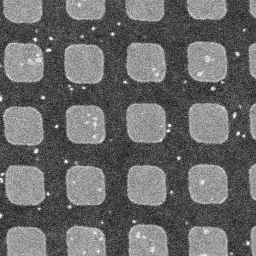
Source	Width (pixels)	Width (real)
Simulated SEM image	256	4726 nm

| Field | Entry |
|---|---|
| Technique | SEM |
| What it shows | a regular array of raised bodies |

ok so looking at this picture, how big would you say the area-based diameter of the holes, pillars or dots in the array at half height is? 756 nanometres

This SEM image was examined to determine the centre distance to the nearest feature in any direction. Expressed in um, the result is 1.12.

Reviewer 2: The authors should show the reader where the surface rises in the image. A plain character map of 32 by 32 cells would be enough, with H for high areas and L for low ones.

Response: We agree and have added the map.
LHHHHLLLHHHHHLLLHHHHLLLHHHHHLLLH
LHHHHLLLLHHHHLLLHHHHLLLLHHHHLLLH
LHHHHLLLLLLLLLLLLLHHLLLLLLLLLLLL
LLLLLLLLLLLLLLLLLLLLLLLLLLLLLLLL
LLLLLLLLLLLLLLLLLLLLLLLLLLLLLLLL
LHHLLLLLLLLLLLLLLHLLLLLLHHHLLLLL
LHHHHLLLHHHHHLLLHHHHLLLLHHHHLLLH
LHHHHLLLHHHHHLLLHHHHHLLLHHHHLLLH
LHHHHLLLHHHHHLLLHHHHHLLLHHHHLLLH
LHHHHLLLHHHHHLLLHHHHHLLLHHHHLLLL
LLLLLLLLLLLLLLLLLLLLLLLLLLLLLLLL
LLLLLLLLLLLLLLLLLLLLLLLLLLLLLLLL
LLLLLLLLLLLLLLLLLLLLLLLLLLLLLLLL
LHHHLLLLLHHHLLLLHHHHLLLLHHHHLLLH
LHHHHLLLHHHHHLLLHHHHHLLLHHHHLLLH
LHHHHLLLHHHHHLLLHHHHHLLLHHHHLLLH
LHHHHLLLHHHHHLLLHHHHHLLLHHHHLLLH
LHHHHLLLLHHHHLLLLHHHLLLLLHHHLLLL
LLLLLLLLLLLLLLLLLLLLLLLLLLLLLLLL
LLLLLLLLLLLLLLLLLLLLLLLLLLLLLLLL
LLLLLLLLLLLLLLLLLLLLLLLLLLLLLLLL
LHHHHLLLLHHHHLLLHHHHLLLLHHHHLLLH
LHHHHLLLHHHHHLLLHHHHHLLLHHHHLLLH
LHHHHLLLHHHHHLLLHHHHHLLLHHHHLLLH
LHHHHLLLHHHHHLLLHHHHHLLLHHHHLLLL
LLLHLLLLLLHHLLLLLLHHLLLLLLLLLLLL
LLLLLLLLLLLLLLLLLLLLLLLLLLLLLLLL
LLLLLLLLLLLLLLLLLLLLLLLLLLLLLLLL
LLHLLLLLLHHLLLLLLHHHLLLLHHLLLLLL
LHHHHLLLHHHHHLLLHHHHHLLLHHHHLLLH
LHHHHHLLHHHHHLLLHHHHHLLLHHHHLLLH
LHHHHHLLLHHHHLLLHHHHHLLLHHHHLLLL